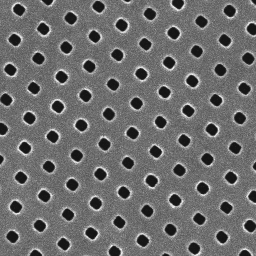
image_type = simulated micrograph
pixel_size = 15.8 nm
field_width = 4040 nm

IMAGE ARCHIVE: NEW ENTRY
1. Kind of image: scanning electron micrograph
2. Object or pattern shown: a regular array of holes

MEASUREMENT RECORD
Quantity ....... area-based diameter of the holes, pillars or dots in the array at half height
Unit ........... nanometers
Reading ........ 181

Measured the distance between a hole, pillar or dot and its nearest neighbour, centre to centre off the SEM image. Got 468 nm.